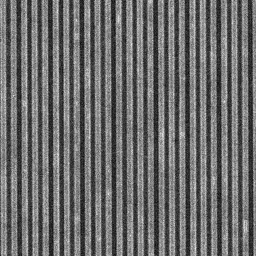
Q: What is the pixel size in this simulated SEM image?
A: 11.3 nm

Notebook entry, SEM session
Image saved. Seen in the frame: parallel lines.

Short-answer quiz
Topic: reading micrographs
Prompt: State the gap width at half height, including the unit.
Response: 0.0567 µm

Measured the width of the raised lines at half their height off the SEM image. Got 56.7 nm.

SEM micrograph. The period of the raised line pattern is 119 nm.